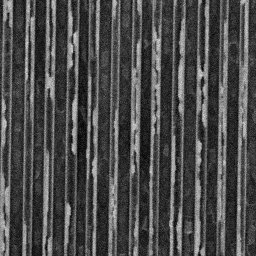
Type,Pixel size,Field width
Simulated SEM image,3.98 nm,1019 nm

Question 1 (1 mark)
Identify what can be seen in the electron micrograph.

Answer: parallel lines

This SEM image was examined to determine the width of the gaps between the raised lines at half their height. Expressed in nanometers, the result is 50.2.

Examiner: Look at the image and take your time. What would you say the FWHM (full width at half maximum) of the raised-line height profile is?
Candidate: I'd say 35.3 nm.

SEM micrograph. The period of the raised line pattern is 85.4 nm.